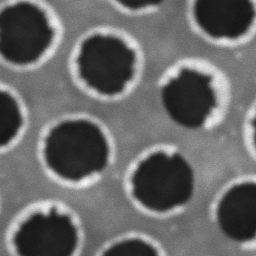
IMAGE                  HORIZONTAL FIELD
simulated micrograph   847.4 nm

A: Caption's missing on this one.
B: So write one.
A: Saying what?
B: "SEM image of holes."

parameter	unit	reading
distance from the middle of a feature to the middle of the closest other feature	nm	295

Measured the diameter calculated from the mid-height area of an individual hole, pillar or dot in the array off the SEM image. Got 197 nm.